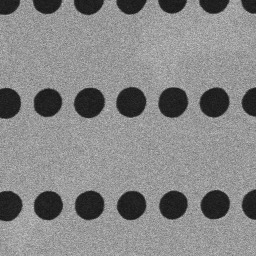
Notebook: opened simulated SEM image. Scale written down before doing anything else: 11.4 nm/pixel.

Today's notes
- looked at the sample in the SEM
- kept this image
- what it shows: a regular array of holes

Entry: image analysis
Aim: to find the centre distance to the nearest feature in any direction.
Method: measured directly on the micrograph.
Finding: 0.472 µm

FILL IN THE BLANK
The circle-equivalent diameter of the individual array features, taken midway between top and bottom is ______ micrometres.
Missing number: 0.336